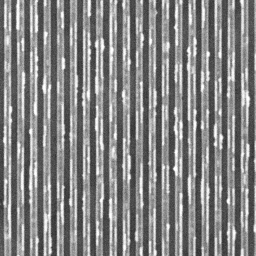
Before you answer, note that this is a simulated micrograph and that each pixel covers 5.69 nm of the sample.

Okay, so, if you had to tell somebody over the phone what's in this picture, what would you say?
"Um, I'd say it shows parallel lines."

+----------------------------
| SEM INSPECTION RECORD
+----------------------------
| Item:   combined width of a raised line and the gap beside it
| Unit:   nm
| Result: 74.9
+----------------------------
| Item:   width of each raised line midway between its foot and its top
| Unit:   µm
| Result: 0.037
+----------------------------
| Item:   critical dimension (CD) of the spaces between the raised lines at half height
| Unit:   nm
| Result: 37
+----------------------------